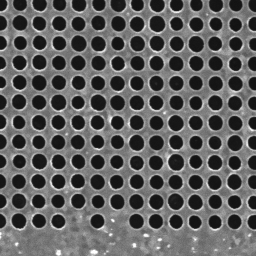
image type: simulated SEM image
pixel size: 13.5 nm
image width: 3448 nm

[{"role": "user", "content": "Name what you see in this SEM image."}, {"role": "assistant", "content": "a regular array of holes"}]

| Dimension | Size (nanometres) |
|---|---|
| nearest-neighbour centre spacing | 260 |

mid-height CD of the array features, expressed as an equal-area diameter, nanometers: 193